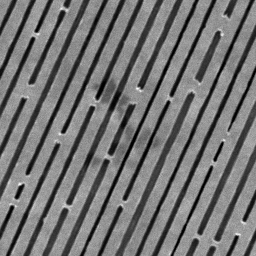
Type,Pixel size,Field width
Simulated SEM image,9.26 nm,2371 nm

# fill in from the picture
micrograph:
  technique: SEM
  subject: parallel lines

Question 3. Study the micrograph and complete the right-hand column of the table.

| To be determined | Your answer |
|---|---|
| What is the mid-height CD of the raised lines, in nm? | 108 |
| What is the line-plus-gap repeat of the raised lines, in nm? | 154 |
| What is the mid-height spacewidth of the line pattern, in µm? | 0.0496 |